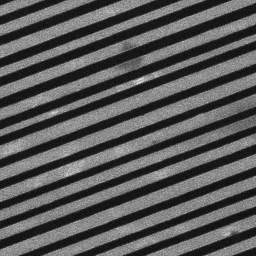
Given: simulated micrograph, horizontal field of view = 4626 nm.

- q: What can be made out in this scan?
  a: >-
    parallel lines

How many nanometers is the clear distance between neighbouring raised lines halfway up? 167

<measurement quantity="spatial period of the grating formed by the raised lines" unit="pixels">19.1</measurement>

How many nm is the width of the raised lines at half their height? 184